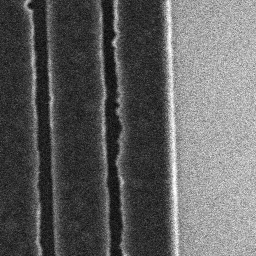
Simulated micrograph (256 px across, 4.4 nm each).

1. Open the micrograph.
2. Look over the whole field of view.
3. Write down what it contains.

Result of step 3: one or a few lines or trenches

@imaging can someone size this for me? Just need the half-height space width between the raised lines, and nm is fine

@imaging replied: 56.6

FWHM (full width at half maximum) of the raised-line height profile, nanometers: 244